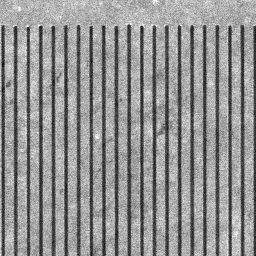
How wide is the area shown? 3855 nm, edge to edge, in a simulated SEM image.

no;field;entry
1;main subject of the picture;parallel lines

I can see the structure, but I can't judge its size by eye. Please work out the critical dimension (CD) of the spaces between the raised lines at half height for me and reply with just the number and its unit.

56.5 nanometers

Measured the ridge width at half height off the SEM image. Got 141 nm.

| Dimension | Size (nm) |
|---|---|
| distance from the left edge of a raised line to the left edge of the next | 190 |